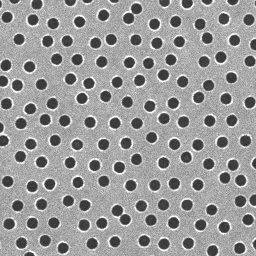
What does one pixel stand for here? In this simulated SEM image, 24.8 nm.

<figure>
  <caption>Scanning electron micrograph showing a regular array of holes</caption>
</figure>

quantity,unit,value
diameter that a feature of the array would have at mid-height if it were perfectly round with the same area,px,11.2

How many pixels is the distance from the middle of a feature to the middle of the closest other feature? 19.7